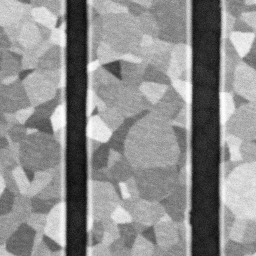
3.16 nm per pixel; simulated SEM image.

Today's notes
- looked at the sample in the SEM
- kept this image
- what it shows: one or a few lines or trenches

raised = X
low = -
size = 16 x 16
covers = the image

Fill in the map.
XXXX--XXXXXX--XX
XXXX--XXXXXX--XX
XXXX--XXXXXX--XX
XXXX--XXXXXX--XX
XXXX--XXXXXX--XX
XXXX--XXXXXX--XX
XXXX--XXXXXX--XX
XXXX--XXXXXX--XX
XXXX--XXXXXX--XX
XXXX--XXXXXX--XX
XXXX--XXXXXX--XX
XXXX--XXXXXX--XX
XXXX--XXXXXX--XX
XXXX--XXXXXX--XX
XXXX--XXXXXX--XX
XXXX--XXXXXX--XX